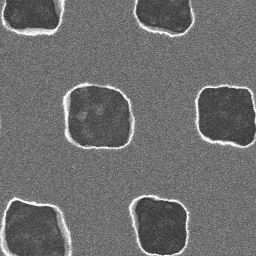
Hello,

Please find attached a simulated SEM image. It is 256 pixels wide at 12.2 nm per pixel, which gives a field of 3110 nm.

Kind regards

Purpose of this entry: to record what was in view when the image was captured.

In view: holes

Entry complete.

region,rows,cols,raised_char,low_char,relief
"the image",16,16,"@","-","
----@@@@@---@@@@
----@@@@@---@@@@
@@@@@@@@@@@@@@@@
@@@@@@@@@@@@@@@@
@@@@@@@@@@@@@@@@
@@@@@--@@@@@@--@
@@@@----@@@@----
@@@@----@@@@----
@@@@----@@@@@---
@@@@@@@@@@@@@@@@
@@@@@@@@@@@@@@@@
@@@@@@@@@@@@@@@@
@@@@@@@@@-@@@@@@
----@@@@----@@@@
----@@@@@---@@@@
----@@@@@--@@@@@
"